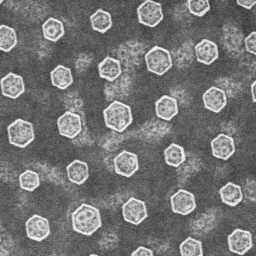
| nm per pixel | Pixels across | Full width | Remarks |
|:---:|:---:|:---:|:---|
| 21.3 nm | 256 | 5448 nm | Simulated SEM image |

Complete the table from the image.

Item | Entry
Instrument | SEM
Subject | a regular array of raised bodies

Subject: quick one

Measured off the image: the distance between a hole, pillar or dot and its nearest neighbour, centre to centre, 1020 nm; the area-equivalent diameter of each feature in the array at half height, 0.48 µm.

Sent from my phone